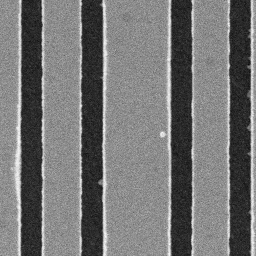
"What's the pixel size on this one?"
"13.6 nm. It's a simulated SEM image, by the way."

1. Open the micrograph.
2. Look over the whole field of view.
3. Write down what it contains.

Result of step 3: lines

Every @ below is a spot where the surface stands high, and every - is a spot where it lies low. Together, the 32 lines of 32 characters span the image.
@@@--@@@@@---@@@@@@@@---@@@@@--@
@@@--@@@@@---@@@@@@@@---@@@@@--@
@@@--@@@@@---@@@@@@@@---@@@@@--@
@@@--@@@@@---@@@@@@@@---@@@@@--@
@@@--@@@@@---@@@@@@@@---@@@@@--@
@@@--@@@@@---@@@@@@@@---@@@@@--@
@@@--@@@@@---@@@@@@@@---@@@@@--@
@@@--@@@@@---@@@@@@@@---@@@@@--@
@@@--@@@@@---@@@@@@@@---@@@@@--@
@@@--@@@@@---@@@@@@@@---@@@@@--@
@@@--@@@@@---@@@@@@@@---@@@@@--@
@@@--@@@@@---@@@@@@@@---@@@@@--@
@@@--@@@@@---@@@@@@@@---@@@@@--@
@@@--@@@@@---@@@@@@@@---@@@@@--@
@@@--@@@@@---@@@@@@@@---@@@@@--@
@@@--@@@@@---@@@@@@@@---@@@@@--@
@@@--@@@@@---@@@@@@@@---@@@@@--@
@@@--@@@@@---@@@@@@@@---@@@@@--@
@@@--@@@@@---@@@@@@@@---@@@@@--@
@@@--@@@@@---@@@@@@@@---@@@@@--@
@@@--@@@@@---@@@@@@@@---@@@@@--@
@@@--@@@@@---@@@@@@@@---@@@@@--@
@@@--@@@@@---@@@@@@@@---@@@@@--@
@@@--@@@@@---@@@@@@@@---@@@@@--@
@@@--@@@@@---@@@@@@@@---@@@@@--@
@@@--@@@@@---@@@@@@@@---@@@@@--@
@@@--@@@@@---@@@@@@@@---@@@@@--@
@@@--@@@@@---@@@@@@@@---@@@@@--@
@@@--@@@@@---@@@@@@@@---@@@@@--@
@@@--@@@@@---@@@@@@@@---@@@@@--@
@@@--@@@@@---@@@@@@@@---@@@@@--@
@@@--@@@@@---@@@@@@@@---@@@@@--@